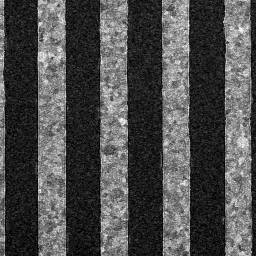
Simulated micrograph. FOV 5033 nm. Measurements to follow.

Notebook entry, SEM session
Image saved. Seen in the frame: one or a few lines or trenches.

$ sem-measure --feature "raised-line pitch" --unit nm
1220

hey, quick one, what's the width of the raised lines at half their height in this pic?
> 526 nm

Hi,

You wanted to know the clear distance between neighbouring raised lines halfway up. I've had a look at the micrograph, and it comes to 690 nm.